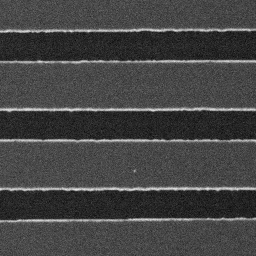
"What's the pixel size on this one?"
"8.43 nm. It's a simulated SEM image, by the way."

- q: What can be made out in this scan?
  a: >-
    lines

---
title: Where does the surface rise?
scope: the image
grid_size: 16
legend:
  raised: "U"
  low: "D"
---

UUUUUUUUUUUUUUUU
UUUUUUUUUUUUUUUU
DDDDDDDDDDDDDDDD
DDDDDDDDDDDDDDDD
UUUUUUUUUUUUUUUU
UUUUUUUUUUUUUUUU
UUUUUUUUUUUUUUUU
DDDDDDDDDDDDDDDD
DDDDDDDDDDDDDDDD
UUUUUUUUUUUUUUUU
UUUUUUUUUUUUUUUU
UUUUUUUUUUUUUUUU
DDDDDDDDDDDDDDDD
DDDDDDDDDDDDDDDD
UUUUUUUUUUUUUUUU
UUUUUUUUUUUUUUUU